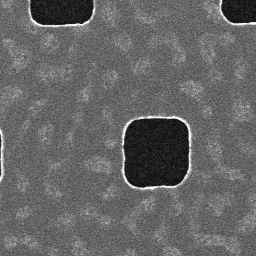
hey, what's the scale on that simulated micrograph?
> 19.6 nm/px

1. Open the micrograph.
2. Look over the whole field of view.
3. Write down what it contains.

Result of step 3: holes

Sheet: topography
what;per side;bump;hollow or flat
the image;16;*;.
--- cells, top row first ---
**....********..
***..***********
****************
****************
****************
****************
****************
*********..*****
********....****
********....****
********....****
********...*****
****************
****************
****************
****************